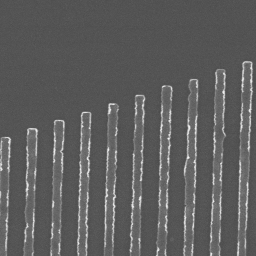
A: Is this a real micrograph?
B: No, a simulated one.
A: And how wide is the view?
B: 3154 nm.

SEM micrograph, parallel lines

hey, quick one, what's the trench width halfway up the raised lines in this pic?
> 17.2 pixels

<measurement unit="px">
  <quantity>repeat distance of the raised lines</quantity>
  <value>26.6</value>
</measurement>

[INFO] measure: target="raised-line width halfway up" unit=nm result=115